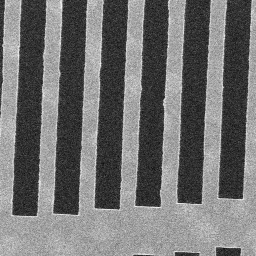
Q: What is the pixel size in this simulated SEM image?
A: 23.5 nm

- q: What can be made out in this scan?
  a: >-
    parallel lines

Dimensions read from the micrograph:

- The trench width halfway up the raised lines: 594 nanometers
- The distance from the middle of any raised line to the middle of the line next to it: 0.97 micrometres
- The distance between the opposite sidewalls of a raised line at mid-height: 367 nanometres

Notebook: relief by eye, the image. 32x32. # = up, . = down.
.##...##...##...##...##...##....
.##...##...##...##...##...##...#
.##...##...##...##...##...##...#
.#....##...##...##...##...##...#
##....##...##...##...##...##...#
.#....##...##...##...##...##...#
#.....##...##...##...##...##...#
##...##....##...##...##...##...#
##...##....##...##...##...##...#
##...##....#....##...##...##...#
##...##....#....##...##...##...#
##....#...##....##...##...##...#
##...##...##....##...##...##...#
##...##...##....#....##...##...#
##...##...##...##....##...##...#
##...##...##...##....##...##...#
##...##...##...##...##....##...#
##...##...##...##...##....##...#
##...##...##...##...##....##...#
##...##...##...##...##....#....#
##...##...##...##...##...##.....
##...##...##...##...##...##....#
##...##...##...##...##...##....#
##....#...##...##...##...##....#
##...##...##...##...##...##...##
#....##...##...##...###..#######
##...##...######################
################################
################################
################################
######.#########################
######################..###...##